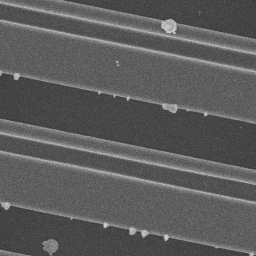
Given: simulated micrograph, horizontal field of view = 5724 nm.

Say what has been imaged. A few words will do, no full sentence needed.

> lines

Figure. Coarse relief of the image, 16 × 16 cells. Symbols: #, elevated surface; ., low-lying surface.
######..........
###########.....
################
################
################
.....###########
..........######
...............#
#####...........
##########......
###############.
################
################
....############
........########
..............##